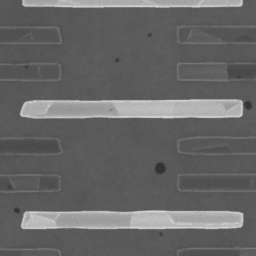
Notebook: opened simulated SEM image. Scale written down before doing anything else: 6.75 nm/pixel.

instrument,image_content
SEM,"wiring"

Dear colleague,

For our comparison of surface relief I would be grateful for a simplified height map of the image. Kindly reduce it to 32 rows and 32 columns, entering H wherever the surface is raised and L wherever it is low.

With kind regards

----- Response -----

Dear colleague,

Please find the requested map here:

LLLHHHHHHHHHHHHHHHHHHHHHHHHHHHLL
LLLLLLLLLLLLLLLLLLLLLLLLLLLLLLLL
LLLLLLLLLLLLLLLLLLLLLLLLLLLLLLLL
HHHHHHHLLLLLLLLLLLLLLLHHHHHHHHHH
HHHHHHHHLLLLLLLLLLLLLLHHHHHHHHHH
LLLLLLLLLLLLLLLLLLLLLLLLLLLLLLLL
LLLLLLLLLLLLLLLLLLLLLLLLLLLLLLLL
LLLLLLLLLLLLLLLLLLLLLLLLLLLLLLLL
HHHHHHHHLLLLLLLLLLLLLLHHHHHHHHHH
HHHHHHHHLLLLLLLLLLLLLLHHHHHHHHHH
LLLLLLLLLLLLLLLLLLLLLLLLLLLLLLLL
LLLLLLLLLLLLLLLLLLLLLLLLLLLLLLLL
LLLLLLLLLLLLLLLLLLLLLLLLLLLLLLLL
LLLHHHHHHHHHHHHHHHHHHHHHHHHHHHLL
LLLHHHHHHHHHHHHHHHHHHHHHHHHHHHLL
LLLLLLLLLLLLLLLLLLLLLLLLLLLLLLLL
LLLLLLLLLLLLLLLLLLLLLLLLLLLLLLLL
HHHHHHHLLLLLLLLLLLLLLLHHHHHHHHHH
HHHHHHHHLLLLLLLLLLLLLLHHHHHHHHHH
LLLLLLLLLLLLLLLLLLLLLLLLLLLLLLLL
LLLLLLLLLLLLLLLLLLLLLLLLLLLLLLLL
LLLLLLLLLLLLLLLLLLLLLLLLLLLLLLLL
HHHHHHHHLLLLLLLLLLLLLLHHHHHHHHHH
HHHHHHHHLLLLLLLLLLLLLLHHHHHHHHHH
LLLLLLLLLLLLLLLLLLLLLLLLLLLLLLLL
LLLLLLLLLLLLLLLLLLLLLLLLLLLLLLLL
LLLLLLLLLLHHHHLLLHHHHHHHHHHHHLLL
LLLHHHHHHHHHHHHHHHHHHHHHHHHHHHLL
LLLHHHLLLLLHHHHLLHHHHLLLLLHLLLLL
LLLLLLLLLLLLLLLLLLLLLLLLLLLLLLLL
LLLLLLLLLLLLLLLLLLLLLLLLLLLLLLLL
HHHHHHHLLLLLLLLLLLLLLLHHHHHHHHHH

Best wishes